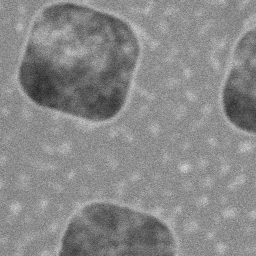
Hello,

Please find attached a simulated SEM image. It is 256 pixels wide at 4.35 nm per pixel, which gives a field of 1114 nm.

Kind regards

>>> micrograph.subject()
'holes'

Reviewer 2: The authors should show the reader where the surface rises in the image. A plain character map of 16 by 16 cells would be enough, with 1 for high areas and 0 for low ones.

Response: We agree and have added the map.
1110001111111111
1100000011111111
1100000001111110
1000000001111110
1000000011111100
1000000011111100
1100000011111100
1111100111111100
1111111111111111
1111111111111111
1111111111111111
1111111111111111
1111111111111111
1111100001111111
1111000000011111
1111000000011111